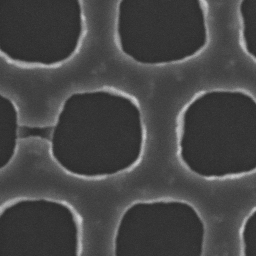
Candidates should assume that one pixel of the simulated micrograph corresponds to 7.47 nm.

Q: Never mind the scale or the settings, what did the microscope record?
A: holes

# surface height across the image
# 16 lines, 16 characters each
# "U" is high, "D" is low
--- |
DDDDDUUDDDDDDUUD
DDDDDUUDDDDDDUUD
DDDDDUUDDDDDDUUD
DDDDUUUUDDDDUUUU
UUUUUUUUUUUUUUUU
UUUUUUUUUUUUUUUU
DUUUDDDDUUUUDDDD
DUUUDDDDDUUDDDDD
DDDDDDDDDUUDDDDD
DUUDDDDDDUUDDDDD
UUUUDDDDUUUUDDDD
UUUUUUUUUUUUUUUU
UUUUUUUUUUUUUUUU
DDDDDUUUDDDDUUUU
DDDDDUUDDDDDDUUD
DDDDDUUDDDDDDUUD